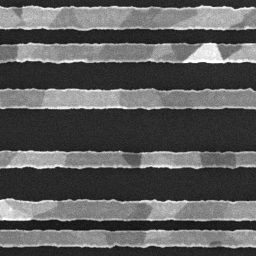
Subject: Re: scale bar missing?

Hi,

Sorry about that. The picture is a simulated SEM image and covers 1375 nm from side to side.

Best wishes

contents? lines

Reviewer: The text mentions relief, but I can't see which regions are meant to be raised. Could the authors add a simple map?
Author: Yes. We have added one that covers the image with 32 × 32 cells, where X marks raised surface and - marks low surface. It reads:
--------------------------------
XXXXXXXXXXXXXXXXXXXXXXXXXXXXXXXX
XXXXXXXXXXXXXXXXXXXXXXXXXXXXXXXX
XXXXXXXXXXXXXXXXXXXXXXXXXXXXXXXX
--------------------------------
---X-----------X------XX--------
XXXXXXXXXXXXXXXXXXXXXXXXXXXXXXXX
XXXXXXXXXXXXXXXXXXXXXXXXXXXXXXXX
--------------------------------
--------------------------------
--------------------------------
XXXXXXXXXXXXXXXXXXXXXXXXXXXXXXXX
XXXXXXXXXXXXXXXXXXXXXXXXXXXXXXXX
X--XXXXXXXXXX--XXXXX-XXXXXXX--XX
--------------------------------
--------------------------------
--------------------------------
--------------------------------
--------------------------------
XXXXXXXXXXXXXXXXXXXXXXXXXXXXXXXX
XXXXXXXXXXXXXXXXXXXXXXXXXXXXXXXX
--------------------------------
--------------------------------
--------------------------------
--------------------------------
XXXXXXXXXXXXXXXXXXXXXXXXXXXXXXXX
XXXXXXXXXXXXXXXXXXXXXXXXXXXXXXXX
--------X---X--XX-------XX---XX-
--------------------------------
XXXXXXXXXXXXXXXXXXXXXXXXXXXXXXXX
XXXXXXXXXXXXXXXXXXXXXXXXXXXXXXXX
--------------------------------